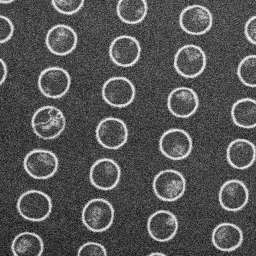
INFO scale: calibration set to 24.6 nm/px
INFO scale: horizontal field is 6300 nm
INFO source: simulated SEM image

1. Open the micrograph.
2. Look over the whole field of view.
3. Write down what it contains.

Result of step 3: a regular array of raised bodies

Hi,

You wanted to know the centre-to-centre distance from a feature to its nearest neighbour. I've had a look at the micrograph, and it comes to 1030 nm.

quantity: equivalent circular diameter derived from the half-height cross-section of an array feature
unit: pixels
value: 29.3